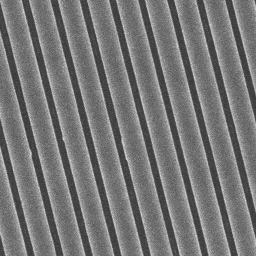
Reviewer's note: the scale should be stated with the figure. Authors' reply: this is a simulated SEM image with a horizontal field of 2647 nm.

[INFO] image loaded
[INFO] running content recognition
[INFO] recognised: parallel lines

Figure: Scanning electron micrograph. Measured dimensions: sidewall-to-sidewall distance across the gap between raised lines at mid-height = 70.2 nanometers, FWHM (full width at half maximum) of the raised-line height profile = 0.217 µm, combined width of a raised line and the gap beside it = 0.292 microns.